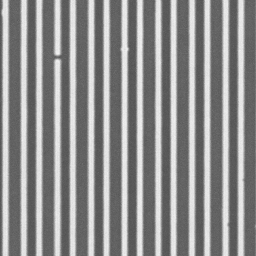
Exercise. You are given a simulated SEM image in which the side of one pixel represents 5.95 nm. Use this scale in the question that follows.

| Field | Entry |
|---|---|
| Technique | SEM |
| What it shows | parallel lines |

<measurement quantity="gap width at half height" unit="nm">69.9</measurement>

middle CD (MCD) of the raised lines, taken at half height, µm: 0.0283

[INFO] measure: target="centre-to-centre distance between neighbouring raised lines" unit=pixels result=16.8